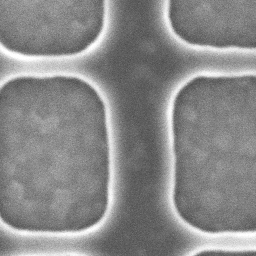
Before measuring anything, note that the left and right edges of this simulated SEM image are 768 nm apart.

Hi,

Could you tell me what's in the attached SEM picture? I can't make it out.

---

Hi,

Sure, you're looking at holes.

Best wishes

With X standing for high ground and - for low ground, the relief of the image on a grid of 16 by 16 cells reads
-------XXX------
-------XXXX-----
------XXXXX-----
X---XXXXXXXXXXXX
XXXXXXXXXXXXXXXX
------XXXXX-----
------XXXXX-----
-------XXXX-----
-------XXXX-----
-------XXXX-----
-------XXXX-----
-------XXXX-----
-------XXXX-----
------XXXXX-----
XXX--XXXXXXXX---
XXXXXXXXXXXXXXXX